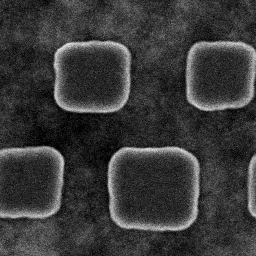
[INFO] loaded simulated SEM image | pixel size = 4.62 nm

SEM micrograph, raised bodies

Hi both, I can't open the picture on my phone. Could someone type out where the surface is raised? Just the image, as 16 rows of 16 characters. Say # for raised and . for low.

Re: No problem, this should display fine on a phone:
................
................
................
....####....####
....####....####
...#####....####
....####....###.
................
................
###....#####....
####...#####....
####...#####....
####...#####....
###....#####....
................
................